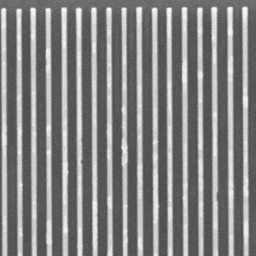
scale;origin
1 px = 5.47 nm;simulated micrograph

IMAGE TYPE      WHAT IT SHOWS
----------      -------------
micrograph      parallel lines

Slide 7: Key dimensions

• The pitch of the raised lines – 82.5 nanometers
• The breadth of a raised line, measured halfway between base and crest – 3.75 px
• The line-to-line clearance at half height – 60.5 nanometres